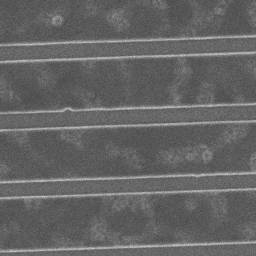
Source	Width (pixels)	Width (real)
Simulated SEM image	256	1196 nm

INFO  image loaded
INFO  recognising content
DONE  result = one or a few lines or trenches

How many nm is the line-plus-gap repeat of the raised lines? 321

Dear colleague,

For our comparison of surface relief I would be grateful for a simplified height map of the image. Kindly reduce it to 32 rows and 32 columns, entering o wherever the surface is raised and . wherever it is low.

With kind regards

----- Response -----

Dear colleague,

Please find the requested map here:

oooooooooooooooooooooooooooooooo
oooooooooooooooooooooooooooooooo
oooooooooooooooooooooooooooooooo
oooooooooooooooooooooooooooooooo
oooooooooooooooooooooooooooooooo
ooooo...........................
................................
.......ooooooooooooooooooooooooo
oooooooooooooooooooooooooooooooo
oooooooooooooooooooooooooooooooo
oooooooooooooooooooooooooooooooo
oooooooooooooooooooooooooooooooo
oooooooooooooooooooooooooooooooo
oooooooooooooooooo..............
................................
.....................ooooooooooo
oooooooooooooooooooooooooooooooo
oooooooooooooooooooooooooooooooo
oooooooooooooooooooooooooooooooo
oooooooooooooooooooooooooooooooo
oooooooooooooooooooooooooooooooo
oooooooooooooooooooooooooooooooo
oooooooo.o......................
................................
........oooooooooooooooooooooooo
oooooooooooooooooooooooooooooooo
oooooooooooooooooooooooooooooooo
oooooooooooooooooooooooooooooooo
oooooooooooooooooooooooooooooooo
oooooooooooooooooooooooooooooooo
oooooooooooooooooooooooooo......
................................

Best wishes